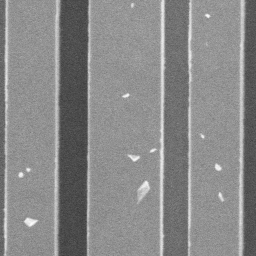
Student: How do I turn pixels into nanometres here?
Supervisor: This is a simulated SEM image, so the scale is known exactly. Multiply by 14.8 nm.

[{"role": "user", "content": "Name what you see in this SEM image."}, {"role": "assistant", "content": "lines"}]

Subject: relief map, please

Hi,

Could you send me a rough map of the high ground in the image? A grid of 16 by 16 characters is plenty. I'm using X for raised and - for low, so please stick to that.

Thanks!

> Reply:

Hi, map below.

XXXX--XXXXXXXXX-
XXXX--XXXXXXXXX-
XXXX--XXXXXXXXX-
XXXX--XXXXXXXXX-
XXXX--XXXXXXXXX-
XXXX--XXXXXXXXX-
XXXX--XXXXXXXXX-
XXXX--XXXXXXXXX-
XXXX--XXXXXXXXX-
XXXX--XXXXXXXXX-
XXXX--XXXXXXXXX-
XXXX--XXXXXXXXX-
XXXX-XXXXXXXXXX-
XXX--XXXXXXXXXX-
XXX--XXXXXXXXXX-
XXX--XXXXXXXXXX-